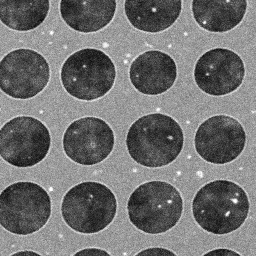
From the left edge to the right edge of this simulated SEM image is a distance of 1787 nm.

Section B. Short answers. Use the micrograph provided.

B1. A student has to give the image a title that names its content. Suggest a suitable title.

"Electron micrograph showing a regular array of holes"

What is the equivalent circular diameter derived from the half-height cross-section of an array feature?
374 nm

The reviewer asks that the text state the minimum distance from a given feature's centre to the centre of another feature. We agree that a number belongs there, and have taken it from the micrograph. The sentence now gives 457 nm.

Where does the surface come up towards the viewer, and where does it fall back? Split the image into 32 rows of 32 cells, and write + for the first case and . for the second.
......+........+.......+.......+
......++......++.......+.......+
......++......++......++......++
+...+++++....++++....++++....+++
++++++++++++++++++++++++++++++++
++++++++++++++++++++++++++++++++
+....+++++...+++++..++++++...+++
......++......+++.....+++.....++
......++......++......++.......+
......++......++......++.......+
......++......+++.....+++.....++
.....+++.....+++++...+++++...+++
++++++++++..++++++++++++++++++++
++++++++++++++++++++++++++++++++
++++++++++++++++++...++++++.++++
+....++++....++++.....+++.....++
......++......++.......+.......+
......++......++.......+.......+
......++......++.......+......++
......++......++......+++.....++
+....+++++..+++++....++++++.++++
++++++++++++++++++++++++++++++++
+++++++++++++++++++++++++++.++++
+....++++.....+++.....+++.....++
......++......++.......+.......+
......++.......+.......+.......+
......++.......+.......+.......+
......++......++......++.......+
+....++++....++++....++++.....++
++++++++++++++++++++++++++++++++
++++++++++++++++++++++++++++++++
++..++++++...++++.....++++...+++